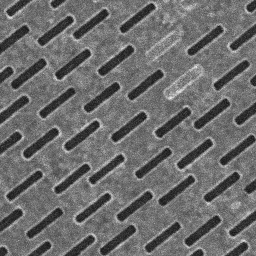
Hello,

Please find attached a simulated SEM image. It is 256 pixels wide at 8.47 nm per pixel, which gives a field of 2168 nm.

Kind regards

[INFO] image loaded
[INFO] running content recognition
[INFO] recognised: a regular array of holes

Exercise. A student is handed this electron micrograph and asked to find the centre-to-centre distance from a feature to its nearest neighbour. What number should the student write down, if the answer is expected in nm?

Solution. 339